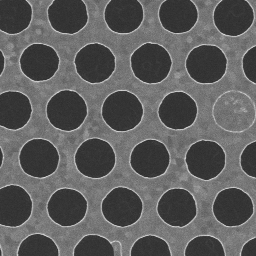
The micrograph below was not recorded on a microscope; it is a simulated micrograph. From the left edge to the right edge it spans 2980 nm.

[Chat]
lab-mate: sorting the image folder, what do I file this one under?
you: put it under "a regular array of holes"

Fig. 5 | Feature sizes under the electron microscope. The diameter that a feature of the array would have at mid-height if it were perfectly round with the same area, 463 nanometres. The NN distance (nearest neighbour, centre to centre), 639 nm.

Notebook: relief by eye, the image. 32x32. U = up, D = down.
DDDDUUDDDDDUUUDDDDUUDDDDUUUDDDDU
DDDDUUDDDDDUUDDDDDUUDDDDDUUDDDDD
DDDDUUDDDDDUUDDDDDUUDDDDDUUDDDDD
DDDUUUUDDDUUUUDDDUUUUDDDUUUDDDDU
UUUUUUUUUUUUUUUUUUUUUUUUUUUUUUUU
UUUUDUUUUUUDUUUUUUDUUUUUUUUUUUUU
UUUDDDDUUUDDDDUUUDDDDUUUDDDDUUUD
DUUDDDDUUDDDDDUUDDDDDUUDDDDDUUDD
DUUDDDDUUUDDDDUUDDDDDUUDDDDDUUDD
UUUDDDDUUUDDDDUUUDDDDUUUDDDDUUUD
UUUUUUUUUUUUUUUUUUUUUUUUUUUUUUUU
UDUUUUUDDUUUUUUDUUUUUUDUUUUUUDUU
DDDDUUDDDDUUUDDDDUUUDDDDUUUDDDDU
DDDDUUDDDDDUUDDDDDUUDDDDDUUDDDDD
DDDDUUDDDDDUUDDDDDUUDDDDDUUDDDDD
DDDUUUDDDDUUUDDDDUUUDDDDUUUDDDDU
UUUUUUUUUUUUUUUUUUUUUUUUUUUUUDUU
UUUUDDUUUUUDDUUUUUUUUUUUUUUUUUUU
UUUDDDDUUUDDDDUUUDDDDUUUDDDDUUUD
UUDDDDDUUDDDDDUUDDDDDUUDDDDDUUDD
UUUDDDDUUDDDDDUUDDDDDUUDDDDDUUDD
UUUDDDDUUUDDDDUUUDDDDUUUDDDDUUUD
UUUUUUUUUUUUUUUUUUUUUUUUUUUUUUUU
DDDUUUUUUUUUUUDDUUUUUUUUUUUUUUUU
DDDDUUDDDDUUUDDDDUUUDDDDUUUDDDDU
DDDDUUDDDDDUUDDDDDUUDDDDUUUDDDDD
DDDDUUDDDDDUUDDDDDUUDDDDDUUDDDDD
DDDUUUUDDDUUUDDDDUUUDDDDUUUDDDDU
UUUUUUUUUUUUUUUUUUUUUUUUUUUUUUUU
UUUUDDUUUUUDUUUUUUDUUUUUUDUUUUUU
UUUDDDDUUUDDDDDUUDDDDUUDDDDDUUUD
UUDDDDDUUDDDDDDUDDDDDUUDDDDDUUDD